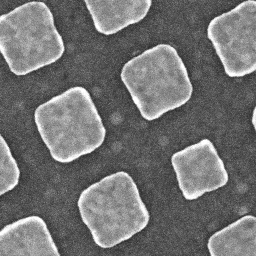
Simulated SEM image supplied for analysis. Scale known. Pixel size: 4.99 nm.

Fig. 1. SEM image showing raised bodies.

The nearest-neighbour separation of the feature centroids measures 474 nm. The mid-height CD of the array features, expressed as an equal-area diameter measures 334 nanometers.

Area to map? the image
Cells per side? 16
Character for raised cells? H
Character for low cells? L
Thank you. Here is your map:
LHHLLLHHHLLLLLLH
HHHLLLHHLLLLLHHH
HHHHLLLLLLLLLHHH
HHHHLLLLLHHLLLHH
LHLLLLLLHHHHLLHL
LLLLLLLLHHHHLLLL
LLLHHHLLLHHLLLLL
LLHHHHLLLLLLLLLL
LLLHHHLLLLLLLLLL
HLLHHHLLLLLHHLLL
HLLLLLLLLLLHHHLL
HLLLLLHHLLLHHHLL
LLLLLHHHHLLLLLLL
LLLLLHHHHLLLLLLL
HHHLLLHHHLLLLLHH
HHHLLLLLLLLLLHHH